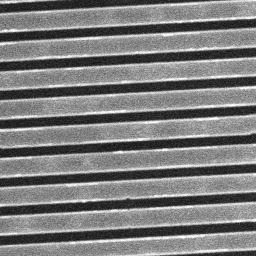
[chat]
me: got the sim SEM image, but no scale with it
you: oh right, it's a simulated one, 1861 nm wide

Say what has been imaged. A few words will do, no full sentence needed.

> parallel lines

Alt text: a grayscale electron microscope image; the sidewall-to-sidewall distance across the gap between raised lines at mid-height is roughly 77.1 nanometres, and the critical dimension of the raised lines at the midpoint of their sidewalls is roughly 134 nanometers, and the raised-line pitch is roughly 0.21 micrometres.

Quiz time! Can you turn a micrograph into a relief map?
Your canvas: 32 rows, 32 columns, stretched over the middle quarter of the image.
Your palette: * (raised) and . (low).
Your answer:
...............*****************
********************************
********************************
********************************
******************..............
*...............................
................................
................****************
********************************
********************************
********************************
***********************.........
*****...........................
................................
....................************
...*****************************
********************************
********************************
****************************....
**********......................
................................
........................********
.......*************************
********************************
********************************
********************************
***************.................
................................
..............................**
............********************
********************************
********************************